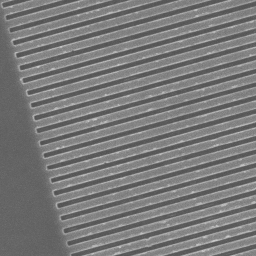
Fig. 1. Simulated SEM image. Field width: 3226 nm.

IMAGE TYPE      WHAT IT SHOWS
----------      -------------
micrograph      parallel lines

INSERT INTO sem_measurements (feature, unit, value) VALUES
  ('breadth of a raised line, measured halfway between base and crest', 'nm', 98.8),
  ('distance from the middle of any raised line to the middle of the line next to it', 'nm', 164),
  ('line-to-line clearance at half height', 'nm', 65.3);